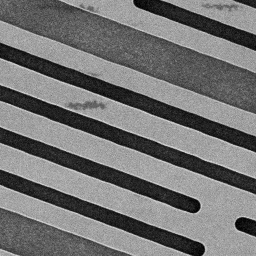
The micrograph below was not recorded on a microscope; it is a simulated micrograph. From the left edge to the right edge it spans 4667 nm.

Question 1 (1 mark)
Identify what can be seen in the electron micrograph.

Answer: groups of lines, slits or small figures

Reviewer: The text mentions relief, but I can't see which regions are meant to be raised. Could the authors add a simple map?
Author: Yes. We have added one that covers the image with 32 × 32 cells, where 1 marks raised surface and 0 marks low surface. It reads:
00000000011111111000001111111100
00000000000111111100000011111111
00000000000000111111100000011111
11000000000000000111111100000011
11111000000000000000111111100000
01111111000000000000001111111100
00011111110000000000000001111111
00000011111110000000000000001111
11100000011111110000000000000011
11111100000111111110000000000000
11111111100000111111100000000000
00111111111000000111111100000000
00000111111111000000111111100000
11000000111111111000001111111100
11111000000111111110000001111111
11111111000000111111110000001111
00111111111000001111111110000011
00001111111110000001111111110000
11000001111111110000011111111100
11110000001111111110000011111111
11111110000001111111100000011111
01111111110000001111111100000011
00001111111100000011111111100000
10000011111111100000011111111100
11110000011111111100000011111111
11111100000011111111100001111111
00111111100000011111111001111111
00001111111100000111111111111100
00000001111111000000111111111100
00000000001111111000000111111111
00000000000001111111000001111111
10000000000000001111111000111111